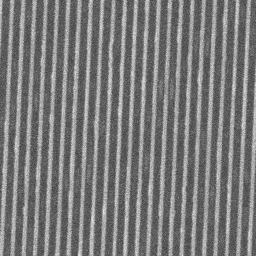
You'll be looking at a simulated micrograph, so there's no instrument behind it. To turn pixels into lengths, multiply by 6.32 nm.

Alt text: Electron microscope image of parallel lines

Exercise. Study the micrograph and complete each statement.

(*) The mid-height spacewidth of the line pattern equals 48.9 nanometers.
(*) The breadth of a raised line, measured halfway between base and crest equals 22.1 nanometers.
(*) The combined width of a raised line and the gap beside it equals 11.3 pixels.